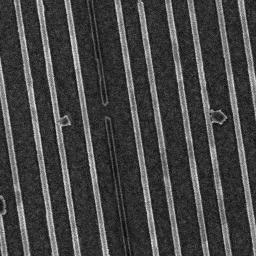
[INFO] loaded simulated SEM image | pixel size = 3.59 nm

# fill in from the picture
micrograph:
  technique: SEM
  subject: parallel lines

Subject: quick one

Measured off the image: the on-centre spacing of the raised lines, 89.5 nm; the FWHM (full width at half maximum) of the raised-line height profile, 17.3 nanometres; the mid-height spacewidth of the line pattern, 18.3 px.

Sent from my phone